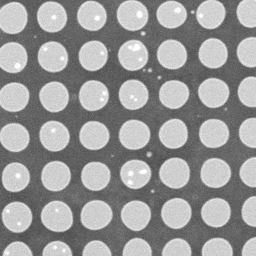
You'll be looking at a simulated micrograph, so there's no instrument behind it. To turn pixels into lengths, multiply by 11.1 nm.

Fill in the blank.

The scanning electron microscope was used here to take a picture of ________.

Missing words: an array of small figures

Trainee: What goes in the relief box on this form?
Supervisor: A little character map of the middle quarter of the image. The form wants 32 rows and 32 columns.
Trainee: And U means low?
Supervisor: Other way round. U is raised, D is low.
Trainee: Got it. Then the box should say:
DDDDDUUUUUDDDDDUUUUUDDDDDUUUUDDD
DDDDDDUUDDDDDDDDDDDDDDDDDDDDDDDD
DDDDDDDDDDDDDDDDDDDDDDDDDDDDDDDD
DDDDDDDDDDDDDDDDDDDDDDDDDDDDDDDD
DDDDDDUUUDDDDDDDUUUDDDDDDDUUUDDD
DDDDDUUUUUDDDDDUUUUUDDDDDUUUUUUD
UDDDUUUUUUUDDDUUUUUUUDDDUUUUUUUD
UDDDUUUUUUUDDDUUUUUUUDDDUUUUUUUD
UDDDUUUUUUUDDDUUUUUUUDDDUUUUUUUD
UDDDUUUUUUUDDDUUUUUUUDDDUUUUUUDD
DDDDDUUUUUDDDDDUUUUUDDDDDDUUUDDD
DDDDDDDUDDDDDDDDDDDDDDDDDDDDDDDD
DDDDDDDDDDDDDDDDDDDDDDDDDDDDDDDD
DDDDDDDDDDDDDDDDDDDDDDDDDDDDDDDD
DDDDDDUUDDDDDDDDUUUDDDDDDDUUUDDD
DDDDDUUUUUDDDDDUUUUUUDDDDUUUUUDD
UDDDUUUUUUUDDDUUUUUUUDDDUUUUUUUD
UDDDUUUUUUUDDDUUUUUUUDDDUUUUUUUD
UDDDUUUUUUUDDDUUUUUUUDDDUUUUUUUD
UDDDUUUUUUUDDDUUUUUUUDDDUUUUUUDD
DDDDDUUUUUDDDDDUUUUUDDDDDDUUUDDD
DDDDDDDDDDDDDDDDDDDDDDDDDDDDDDDD
DDDDDDDDDDDDDDDDDDDDDDDDDDDDDDDD
DDDDDDDDDDDDDDDDDDDDDDDDDDDDDDDD
DDDDDDDDDDDDDDDDUUUUDDDDDUUUUUDD
UDDDDUUUUUDDDDDUUUUUUDDDUUUUUUUD
UDDDDUUUUUUDDDUUUUUUUUDDUUUUUUUD
UDDDUUUUUUUDDDUUUUUUUUDDUUUUUUUD
UDDDUUUUUUUDDDUUUUUUUDDDUUUUUUUD
UDDDDUUUUUUDDDDUUUUUUDDDDUUUUUUD
UDDDDUUUUUDDDDDDUUUUDDDDDDUUUUDD
DDDDDDDDDDDDDDDDDDDDDDDDDDDDDDDD